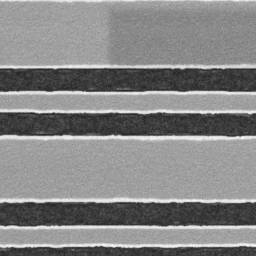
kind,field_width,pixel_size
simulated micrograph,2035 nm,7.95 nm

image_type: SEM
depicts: lines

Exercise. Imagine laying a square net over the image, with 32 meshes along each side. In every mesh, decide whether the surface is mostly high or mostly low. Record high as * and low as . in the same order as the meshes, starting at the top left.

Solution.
********************************
********************************
********************************
********************************
********************************
********************************
********************************
********************************
................................
................................
................................
....*..**.........****...***....
********************************
********************************
................................
................................
................................
********************************
********************************
********************************
********************************
********************************
********************************
********************************
********************************
................................
................................
................................
********************************
********************************
********************************
................................